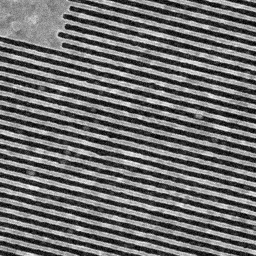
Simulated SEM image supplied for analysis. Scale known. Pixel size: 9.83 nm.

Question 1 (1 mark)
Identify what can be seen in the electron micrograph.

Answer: parallel lines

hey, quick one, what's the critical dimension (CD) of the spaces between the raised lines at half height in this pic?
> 57.2 nm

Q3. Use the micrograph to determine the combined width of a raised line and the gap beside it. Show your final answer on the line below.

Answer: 0.0926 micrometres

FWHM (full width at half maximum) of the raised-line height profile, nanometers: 33.4